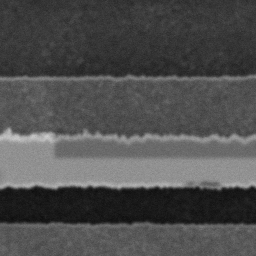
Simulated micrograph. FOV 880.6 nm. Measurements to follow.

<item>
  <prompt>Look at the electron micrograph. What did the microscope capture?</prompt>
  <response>lines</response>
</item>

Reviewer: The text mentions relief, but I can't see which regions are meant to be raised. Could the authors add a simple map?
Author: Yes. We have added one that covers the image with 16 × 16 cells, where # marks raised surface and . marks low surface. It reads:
................
................
................
................
................
################
################
################
################
################
################
################
................
................
################
################